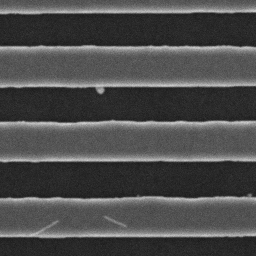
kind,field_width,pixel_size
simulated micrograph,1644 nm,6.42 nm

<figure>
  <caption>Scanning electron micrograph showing lines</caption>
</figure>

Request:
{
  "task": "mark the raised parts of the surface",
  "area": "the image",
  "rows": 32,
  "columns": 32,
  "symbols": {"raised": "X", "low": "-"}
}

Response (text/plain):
XXXXXXXXXXXXXXXXXXXXXXXXXXXXXXXX
XXXXXXXXXXXXXXXX-X-XXXX---------
--------------------------------
--------------------------------
--------------------------------
--------------------------------
XXXXXXXXXXXXXXXXXXXXXXXXXXXXXXXX
XXXXXXXXXXXXXXXXXXXXXXXXXXXXXXXX
XXXXXXXXXXXXXXXXXXXXXXXXXXXXXXXX
XXXXXXXXXXXXXXXXXXXXXXXXXXXXXXXX
XXXXXXXXXXXXXXXXXXXXXXXXXXXXXXXX
--------------------------------
--------------------------------
--------------------------------
--------------------------------
XXXXXXXXXXXXXXXXXXXXXXXXXXXXXXXX
XXXXXXXXXXXXXXXXXXXXXXXXXXXXXXXX
XXXXXXXXXXXXXXXXXXXXXXXXXXXXXXXX
XXXXXXXXXXXXXXXXXXXXXXXXXXXXXXXX
XXXXXXXXXXXXXXXXXXXXXXXXXXXXXXXX
--------------------------------
--------------------------------
--------------------------------
--------------------------------
--------------------------------
XXXXXXXXXXXXXXXXXXXXXXXXXXXXXXXX
XXXXXXXXXXXXXXXXXXXXXXXXXXXXXXXX
XXXXXXXXXXXXXXXXXXXXXXXXXXXXXXXX
XXXXXXXXXXXXXXXXXXXXXXXXXXXXXXXX
XXXXXXXXXXXXXXXXXXXXXXXXXXX-----
--------------------------------
--------------------------------